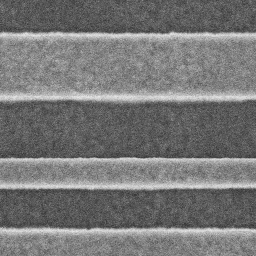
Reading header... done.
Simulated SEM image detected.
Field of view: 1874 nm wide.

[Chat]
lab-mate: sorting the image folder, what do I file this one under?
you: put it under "lines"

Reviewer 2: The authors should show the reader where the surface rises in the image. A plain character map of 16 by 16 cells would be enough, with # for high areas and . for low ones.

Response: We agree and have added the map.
................
................
################
################
################
################
................
................
................
................
################
################
................
................
################
################